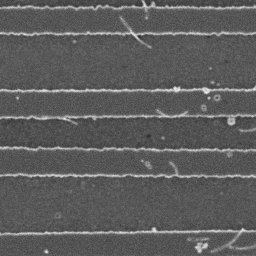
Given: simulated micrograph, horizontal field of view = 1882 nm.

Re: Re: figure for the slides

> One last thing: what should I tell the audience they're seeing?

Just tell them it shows lines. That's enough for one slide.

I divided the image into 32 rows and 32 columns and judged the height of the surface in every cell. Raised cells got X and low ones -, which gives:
--------------------------------
XXXXXXXXXXXXXXXXXXXXXXXXXXXXXXXX
XXXXXXXXXXXXXXXXXXXXXXXXXXXXXXXX
XXXXXXXXXXXXXXXXXXXXXXXXXXXXXXXX
--------------------------------
--------------------------------
--------------------------------
--------------------------------
--------------------------------
--------------------------------
--------------------------------
XXXXXXXXXXXXXXXXXXXXXXXXXXXXXXXX
XXXXXXXXXXXXXXXXXXXXXXXXXXXXXXXX
XXXXXXXXXXXXXXXXXXXXXXXXXXXXXXXX
XXXXXXXXXXXXXXXXXXXXXXXXXXXXXXXX
--------------------------------
--------------------------------
--------------------------------
XXX--X-X------------------------
XXXXXXXXXXXXXXXXXXXXXXXXXXXXXXXX
XXXXXXXXXXXXXXXXXXXXXXXXXXXXXXXX
XXXXXXXXXXXXXXXXXXXXXXXXXXXXXXXX
--------------------------------
--------------------------------
--------------------------------
--------------------------------
--------------------------------
--------------------------------
--------------------------------
XXXXXXXXXXXXXXXXXXXXXXXXXXXXXXXX
XXXXXXXXXXXXXXXXXXXXXXXXXXXXXXXX
XXXXXXXXXXXXXXXXXXXXXXXXXXXXXXXX